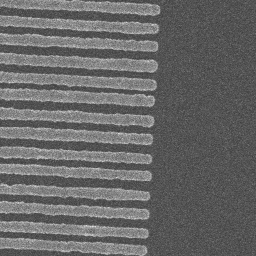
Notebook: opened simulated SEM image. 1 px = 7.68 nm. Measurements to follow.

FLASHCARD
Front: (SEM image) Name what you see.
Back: parallel lines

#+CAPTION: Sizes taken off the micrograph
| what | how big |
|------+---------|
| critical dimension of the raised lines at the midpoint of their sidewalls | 75.8 nm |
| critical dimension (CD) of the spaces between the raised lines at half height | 65.2 nanometers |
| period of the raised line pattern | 142 nanometres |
